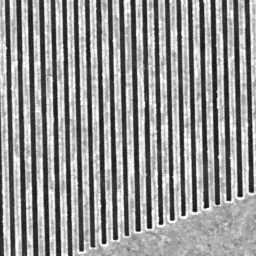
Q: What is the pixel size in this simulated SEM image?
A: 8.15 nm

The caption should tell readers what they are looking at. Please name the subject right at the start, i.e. parallel lines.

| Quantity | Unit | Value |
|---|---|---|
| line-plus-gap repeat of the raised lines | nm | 93.2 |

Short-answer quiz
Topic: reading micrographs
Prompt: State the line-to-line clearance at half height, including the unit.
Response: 0.0499 µm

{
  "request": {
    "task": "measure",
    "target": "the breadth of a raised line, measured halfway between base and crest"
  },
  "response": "42.8 nanometres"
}